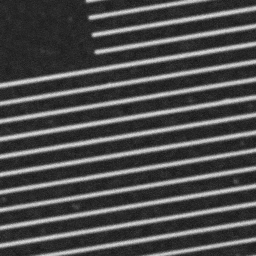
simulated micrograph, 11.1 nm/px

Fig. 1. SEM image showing parallel lines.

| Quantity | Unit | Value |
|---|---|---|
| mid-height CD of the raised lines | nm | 35.6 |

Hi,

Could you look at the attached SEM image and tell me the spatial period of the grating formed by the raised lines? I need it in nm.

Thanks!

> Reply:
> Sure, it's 194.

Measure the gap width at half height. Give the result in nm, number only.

160